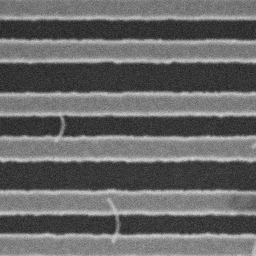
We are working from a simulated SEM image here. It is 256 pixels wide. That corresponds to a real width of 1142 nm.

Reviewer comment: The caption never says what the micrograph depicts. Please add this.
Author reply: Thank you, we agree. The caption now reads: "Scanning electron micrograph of lines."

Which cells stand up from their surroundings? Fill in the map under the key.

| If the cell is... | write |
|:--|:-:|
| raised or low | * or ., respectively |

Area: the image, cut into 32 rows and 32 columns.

********************************
********************************
........................*.......
................................
................................
********************************
********************************
********************************
................................
................................
................................
................................
********************************
********************************
.......*...................*....
................................
................................
********************************
********************************
********************************
................................
................................
................................
................................
********************************
********************************
********************************
................................
................................
********************************
********************************
********************************